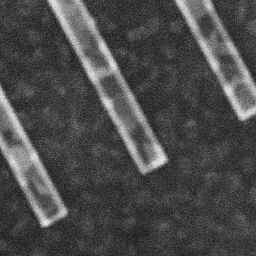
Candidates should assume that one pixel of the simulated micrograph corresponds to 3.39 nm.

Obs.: one or a few lines or trenches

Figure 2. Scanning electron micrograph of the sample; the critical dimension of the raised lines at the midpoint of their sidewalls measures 79.2 nm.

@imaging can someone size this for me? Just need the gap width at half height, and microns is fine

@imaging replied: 0.3